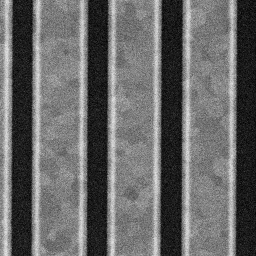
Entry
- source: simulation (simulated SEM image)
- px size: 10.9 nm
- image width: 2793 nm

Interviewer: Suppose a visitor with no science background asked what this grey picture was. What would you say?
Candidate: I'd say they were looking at one or a few lines or trenches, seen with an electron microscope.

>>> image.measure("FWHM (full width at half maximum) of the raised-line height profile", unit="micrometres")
0.479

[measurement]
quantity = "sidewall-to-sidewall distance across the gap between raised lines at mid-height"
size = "344 nanometres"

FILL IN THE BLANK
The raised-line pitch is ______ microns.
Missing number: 0.818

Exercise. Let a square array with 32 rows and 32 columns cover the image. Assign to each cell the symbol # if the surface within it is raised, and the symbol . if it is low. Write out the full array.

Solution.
#....#####....#####.....#####...
#....#####....#####.....#####...
#....#####....#####.....#####...
#....#####....#####.....#####...
#....#####....#####.....#####...
#....#####....#####.....#####...
#....#####....#####.....#####...
#....#####....#####.....#####...
#....#####....#####.....#####...
#....#####....#####.....#####...
#....#####....#####.....#####...
#....#####....#####.....#####...
#....#####....#####....######...
#....#####....######...######...
#....#####....#####....######...
#....#####....#####....######...
#....#####....#####....######...
#....#####....#####....######...
#....#####....#####....######...
#....#####....#####....######...
#....#####....#####....######...
#....#####....#####....######...
#....#####....#####....######...
#....#####....#####....######...
#....#####....#####....######...
#....#####....#####....######...
#....#####....#####....######...
#....#####....#####....######...
#....#####....#####....######...
#....#####....#####....######...
#....#####....#####....######...
#....#####....#####....######...